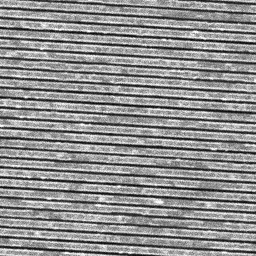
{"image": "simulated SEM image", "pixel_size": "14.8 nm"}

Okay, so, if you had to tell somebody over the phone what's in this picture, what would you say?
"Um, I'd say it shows parallel lines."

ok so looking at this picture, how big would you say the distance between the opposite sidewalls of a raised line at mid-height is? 107 nm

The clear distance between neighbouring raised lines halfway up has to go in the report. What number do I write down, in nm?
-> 40.8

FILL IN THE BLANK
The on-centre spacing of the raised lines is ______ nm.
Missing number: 147